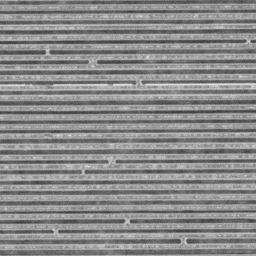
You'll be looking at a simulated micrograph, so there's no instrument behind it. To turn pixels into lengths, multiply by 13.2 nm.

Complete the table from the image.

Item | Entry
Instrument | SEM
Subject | parallel lines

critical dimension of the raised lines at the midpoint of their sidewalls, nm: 69.2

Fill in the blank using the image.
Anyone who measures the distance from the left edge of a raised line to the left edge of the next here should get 131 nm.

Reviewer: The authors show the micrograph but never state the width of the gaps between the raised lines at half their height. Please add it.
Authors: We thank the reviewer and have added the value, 69.2 nm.